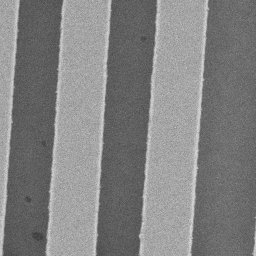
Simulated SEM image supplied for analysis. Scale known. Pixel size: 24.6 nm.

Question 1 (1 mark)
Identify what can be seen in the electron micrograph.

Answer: lines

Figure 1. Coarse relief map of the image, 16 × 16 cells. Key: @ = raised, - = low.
@---@@@---@@@---
@---@@@---@@@---
@---@@@---@@@---
@---@@@---@@@---
@---@@@---@@@---
@---@@@--@@@@---
@---@@@--@@@@---
@--@@@---@@@@---
@--@@@---@@@----
@--@@@---@@@----
@--@@@---@@@----
---@@@---@@@----
---@@@---@@@----
---@@@---@@@----
---@@@---@@@----
---@@@---@@@----